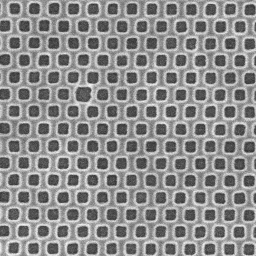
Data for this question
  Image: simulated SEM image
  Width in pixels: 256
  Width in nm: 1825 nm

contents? a regular array of holes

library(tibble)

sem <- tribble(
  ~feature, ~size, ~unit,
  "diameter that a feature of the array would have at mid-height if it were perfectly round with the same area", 13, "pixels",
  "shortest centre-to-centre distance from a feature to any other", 19.2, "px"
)